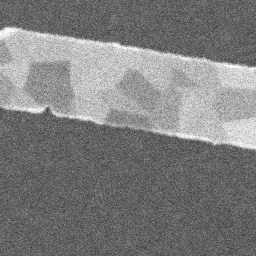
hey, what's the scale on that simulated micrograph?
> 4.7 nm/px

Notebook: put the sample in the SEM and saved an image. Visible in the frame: one or a few lines or trenches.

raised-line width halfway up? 368 nm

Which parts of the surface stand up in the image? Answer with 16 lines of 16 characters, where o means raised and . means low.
................
................
ooooo...........
ooooooooooo.....
oooooooooooooooo
oooooooooooooooo
oooooooooooooooo
......oooooooooo
...........ooooo
................
................
................
................
................
................
................